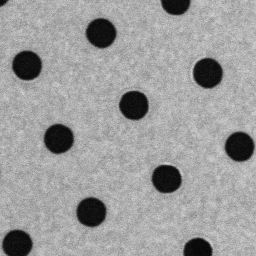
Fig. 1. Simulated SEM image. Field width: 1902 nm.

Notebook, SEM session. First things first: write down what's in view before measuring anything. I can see a regular array of holes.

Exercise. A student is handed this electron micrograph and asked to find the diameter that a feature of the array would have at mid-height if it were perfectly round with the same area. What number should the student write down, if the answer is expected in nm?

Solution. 222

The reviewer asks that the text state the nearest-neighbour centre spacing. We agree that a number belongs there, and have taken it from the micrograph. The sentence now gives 592 nanometers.